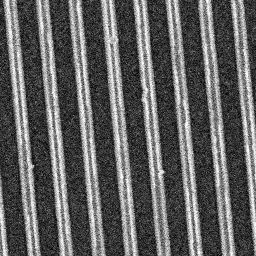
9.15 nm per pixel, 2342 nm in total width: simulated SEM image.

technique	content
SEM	parallel lines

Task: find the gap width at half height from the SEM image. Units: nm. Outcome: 198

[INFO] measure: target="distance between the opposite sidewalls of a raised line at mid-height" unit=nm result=99.1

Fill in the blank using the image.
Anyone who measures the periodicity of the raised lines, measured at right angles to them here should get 295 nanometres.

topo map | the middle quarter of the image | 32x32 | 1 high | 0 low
00011100000111000001110000011100
00011100000111000001110000011100
00011100000111000001110000011100
00011100000111000001110000001100
00011100000011000001110000001100
00011100000011000000110000001100
00001100000011000000110000001100
00001100000011000000111000001110
00001100000011000000111000001110
00001100000011100000111000001110
00001100000011100000111000001110
00001110000011100000111000001110
00001110000011100000111000001110
00001110000011100000111000000110
00001110000001100000111000000110
00001110000001100000011000000110
00000110000001100000011000000110
00000110000001100000011100000110
00000110000001100000011100000111
00000110000001110000011100000111
00000110000001110000011100000111
00000111000001110000011100000111
00000111000001110000011100000111
00000111000001110000011100000111
00000111000001110000011100000011
00000111000000110000011100000011
00000111000000110000001110000011
00000011000000110000001100000011
00000011000000110000001100000011
00000011000000110000001110000011
00000011000000111000001110000011
00000011000000111000001110000011